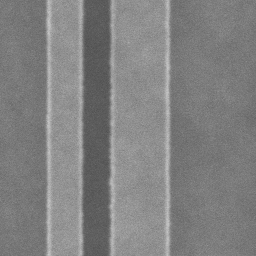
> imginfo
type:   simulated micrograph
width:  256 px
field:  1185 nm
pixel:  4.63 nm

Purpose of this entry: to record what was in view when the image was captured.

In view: lines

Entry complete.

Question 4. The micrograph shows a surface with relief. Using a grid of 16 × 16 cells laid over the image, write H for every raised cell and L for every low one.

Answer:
LLLHHLLHHHHLLLLL
LLLHHLLHHHHLLLLL
LLLHHLLHHHHLLLLL
LLLHHLLHHHHLLLLL
LLLHHLLHHHHLLLLL
LLLHHLLHHHHLLLLL
LLLHHLLHHHHLLLLL
LLLHHLLHHHHLLLLL
LLLHHLLHHHHLLLLL
LLLHHLLHHHHLLLLL
LLLHHLLHHHHLLLLL
LLLHHLLHHHHLLLLL
LLLHHLLHHHHLLLLL
LLLHHLLHHHHLLLLL
LLLHHLLHHHHLLLLL
LLLHHLLHHHHLLLLL